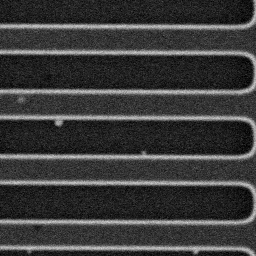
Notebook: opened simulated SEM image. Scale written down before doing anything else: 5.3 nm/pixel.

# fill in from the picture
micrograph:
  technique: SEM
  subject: groups of lines, slits or small figures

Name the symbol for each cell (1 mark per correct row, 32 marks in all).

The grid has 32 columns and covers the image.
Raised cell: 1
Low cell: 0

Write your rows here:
00000000000000000000000000000000
00000000000000000000000000000000
00000000000000000000000000000000
11111111111111111111111111111111
11111111111111111111111111111111
11111111111111111111111111111111
11111111111111111111111111111111
00000000000000000000000000000000
00000000000000000000000000000000
00000000000000000000000000000000
00000000000000000000000000000000
11111111111111111111111111111111
11111111111111111111111111111111
11111111111111111111111111111111
11111111111111111111111111111111
00000000000000000000000000000001
00000000000000000000000000000000
00000000000000000000000000000000
00000000000000000000000000000000
00000000000000000000000000000001
11111111111111111111111111111111
11111111111111111111111111111111
11111111111111111111111111111111
00000000000000000000000000000001
00000000000000000000000000000000
00000000000000000000000000000000
00000000000000000000000000000000
00000000000000000000000000000001
11111111111111111111111111111111
11111111111111111111111111111111
11111111111111111111111111111111
00000000000000000000000000000001